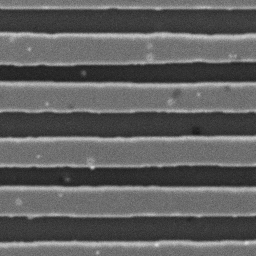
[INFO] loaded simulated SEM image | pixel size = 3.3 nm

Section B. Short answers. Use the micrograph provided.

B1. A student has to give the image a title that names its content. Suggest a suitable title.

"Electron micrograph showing lines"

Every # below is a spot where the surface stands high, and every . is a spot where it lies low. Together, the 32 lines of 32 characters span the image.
################################
................................
................................
................................
################################
################################
################################
################################
................................
................................
################################
################################
################################
################################
................................
................................
................................
################################
################################
################################
################################
................................
................................
#############################.##
################################
################################
################################
................................
................................
................................
################################
################################